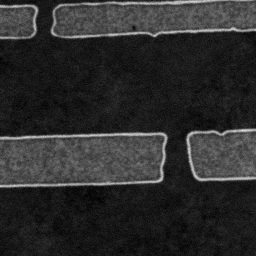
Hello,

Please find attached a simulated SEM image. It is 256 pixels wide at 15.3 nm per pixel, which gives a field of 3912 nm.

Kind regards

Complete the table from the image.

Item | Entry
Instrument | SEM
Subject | one or a few lines or trenches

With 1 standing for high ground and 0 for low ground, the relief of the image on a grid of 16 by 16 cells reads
0011000000000000
0010000000000000
1111111111111111
1111111111111111
1111111111111111
1111111111111111
1111111111111111
1111111111111111
1111100000110000
0000000000110000
0000000000110000
0000001111111111
1111111111111111
1111111111111111
1111111111111111
1111111111111111